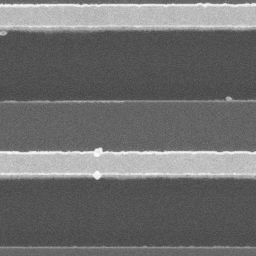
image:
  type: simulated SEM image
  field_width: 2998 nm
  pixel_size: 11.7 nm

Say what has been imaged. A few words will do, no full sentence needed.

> lines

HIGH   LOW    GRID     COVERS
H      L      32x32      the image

HHHHHHHHHHHHHHHHHHHHHHHHHHHHHHHH
HHHHHHHHHHHHHHHHHHHHHHHHHHHHHHHH
HHHHHHHHHHHHHHHHHHHHHHHHHHHHHHHH
LLLLLLLLLLLLLLLLLLLLLLLLLLLLLLLL
LLLLLLLLLLLLLLLLLLLLLLLLLLLLLLLL
LLLLLLLLLLLLLLLLLLLLLLLLLLLLLLLL
LLLLLLLLLLLLLLLLLLLLLLLLLLLLLLLL
LLLLLLLLLLLLLLLLLLLLLLLLLLLLLLLL
LLLLLLLLLLLLLLLLLLLLLLLLLLLLLLLL
LLLLLLLLLLLLLLLLLLLLLLLLLLLLLLLL
LLLLLLLLLLLLLLLLLLLLLLLLLLLLLLLL
LLLLLLLLLLLLLLLLLLLLLLLLLLLLLLLL
LLLLLLLLLLLLLLLLLLLLLLLLLLLLLLLL
HHHHHHHHHHHHHHHHHHHHHHHHHHHHHHHH
HHHHHHHHHHHHHHHHHHHHHHHHHHHHHHHH
HHHHHHHHHHHHHHHHHHHHHHHHHHHHHHHH
HHHHHHHHHHHHHHHHHHHHHHHHHHHHHHHH
HHHHHHHHHHHHHHHHHHHHHHHHHHHHHHHH
HHHHHHHHHHHHHHHHHHHHHHHHHHHHHHHH
HHHHHHHHHHHHHHHHHHHHHHHHHHHHHHHH
HHHHHHHHHHHHHHHHHHHHHHHHHHHHHHHH
HHHHHHHHHHHHHHHHHHHHHHHHHHHHHHHH
LLLLLLLLLLLLLLLLLLLLLLLLLLLLLLLL
LLLLLLLLLLLLLLLLLLLLLLLLLLLLLLLL
LLLLLLLLLLLLLLLLLLLLLLLLLLLLLLLL
LLLLLLLLLLLLLLLLLLLLLLLLLLLLLLLL
LLLLLLLLLLLLLLLLLLLLLLLLLLLLLLLL
LLLLLLLLLLLLLLLLLLLLLLLLLLLLLLLL
LLLLLLLLLLLLLLLLLLLLLLLLLLLLLLLL
LLLLLLLLLLLLLLLLLLLLLLLLLLLLLLLL
LLLLLLLLLLLLLLLLLLLLLLLLLLLLLLLL
HHHHHHHHHHHHHHHHHHHHHHHHHHHHHHHH